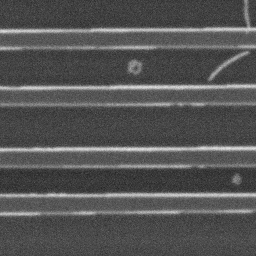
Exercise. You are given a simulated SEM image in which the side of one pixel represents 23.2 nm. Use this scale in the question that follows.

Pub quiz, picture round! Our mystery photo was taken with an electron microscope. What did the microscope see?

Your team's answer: lines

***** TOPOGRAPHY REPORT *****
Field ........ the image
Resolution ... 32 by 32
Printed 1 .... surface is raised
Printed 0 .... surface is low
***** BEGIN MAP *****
00000000000000000000000000000000
00000000000000000000000000000000
00000000000000000000000000000000
00000000000000000000000000000001
11111111111111111111111111111111
11111111111111111111111111111111
00000000000000000000000000000000
00000000000000000000000000000000
00000000000000000000000000000000
00000000000000000000000000000000
00000000000000000000000000000000
11111111111111111111111111111111
11111111111111111111111111111111
00000000000000000000000000000000
00000000000000000000000000000000
00000000000000000000000000000000
00000000000000000000000000000000
00000000000000000000000000000000
00000000000000000000000000000000
11111111111111111111111111111111
11111111111111111111111111111111
00000000000000000000000000000000
00000000000000000000000000000000
00000000000000000000000000000000
11111111111111111111111111111111
11111111111111111111111111111111
11111111111111111111111000000000
00000000000000000000000000000000
00000000000000000000000000000000
00000000000000000000000000000000
00000000000000000000000000000000
00000000000000000000000000000000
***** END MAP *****